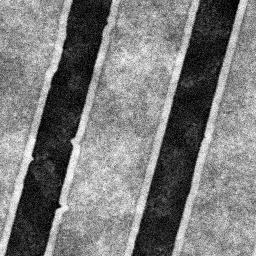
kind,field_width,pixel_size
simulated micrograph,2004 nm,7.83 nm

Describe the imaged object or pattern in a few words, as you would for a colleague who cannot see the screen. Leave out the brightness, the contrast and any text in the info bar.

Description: one or a few lines or trenches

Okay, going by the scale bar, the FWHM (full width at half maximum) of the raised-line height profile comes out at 0.61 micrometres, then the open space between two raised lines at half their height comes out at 351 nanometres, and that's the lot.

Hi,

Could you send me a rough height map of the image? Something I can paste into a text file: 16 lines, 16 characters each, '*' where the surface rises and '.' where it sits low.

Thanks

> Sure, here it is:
****...*****...*
****...*****...*
****...*****...*
****..*****...**
***...*****...**
***...*****...**
***...*****..***
**...*****...***
**...*****...***
**...*****...***
**..*****...****
*...*****...****
*...*****...****
*...*****...****
...*****...*****
...*****...*****